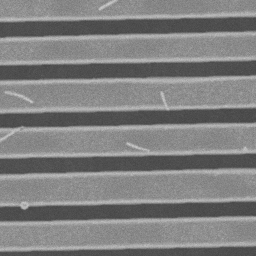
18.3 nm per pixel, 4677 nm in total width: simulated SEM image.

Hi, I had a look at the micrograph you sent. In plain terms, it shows lines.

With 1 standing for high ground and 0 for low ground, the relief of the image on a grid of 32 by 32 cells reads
11111111111111111111111111111111
11111111111111111111111111111111
11111100000000000000000000000000
00000000000000000000000000000000
00000000000011111111111111111111
11111111111111111111111111111111
11111111111111111111111111111111
11111111111111111111111111111000
00000000000000000000000000000000
00000000000000000000000000000000
11111111111111111111111111111111
11111111111111111111111111111111
11111111111111111111111111111111
11111111111111111111111110000000
00000000000000000000000000000000
00000000000000000000000000011111
11111111111111111111111111111111
11111111111111111111111111111111
11111111111111111111111111111111
11111111100000000000000000000000
00000000000000000000000000000000
00000000000000001111111111111111
11111111111111111111111111111111
11111111111111111111111111111111
11111111111111111111111111111111
11111111110000000000000000000000
00000000000000000000000000000000
00000000000001111111111111111111
11111111111111111111111111111111
11111111111111111111111111111111
11111111111111111111111111111111
00000000000000000000000000000000